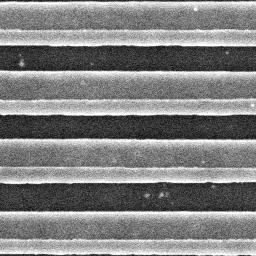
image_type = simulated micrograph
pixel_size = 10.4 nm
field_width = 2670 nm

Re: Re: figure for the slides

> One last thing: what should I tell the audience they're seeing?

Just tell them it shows lines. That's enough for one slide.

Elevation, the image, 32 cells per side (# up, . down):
################################
################################
################################
################################
################################
################################
................................
................................
................................
################################
################################
################################
################################
################################
................................
................................
................................
................................
################################
################################
################################
################################
################################
................................
................................
................................
................................
################################
################################
################################
################################
################################